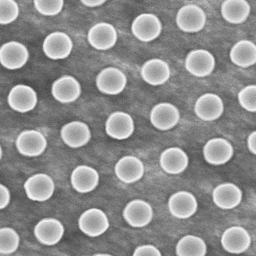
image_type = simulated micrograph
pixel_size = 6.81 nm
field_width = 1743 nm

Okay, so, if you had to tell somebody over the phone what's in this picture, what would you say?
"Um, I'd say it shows a regular array of raised bodies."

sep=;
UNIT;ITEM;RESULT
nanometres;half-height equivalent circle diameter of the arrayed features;186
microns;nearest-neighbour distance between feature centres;0.306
